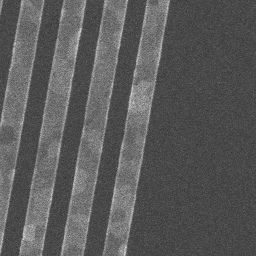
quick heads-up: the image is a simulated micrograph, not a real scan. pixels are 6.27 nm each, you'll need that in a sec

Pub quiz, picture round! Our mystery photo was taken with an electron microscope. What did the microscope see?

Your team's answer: parallel lines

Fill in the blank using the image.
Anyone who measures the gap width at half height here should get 122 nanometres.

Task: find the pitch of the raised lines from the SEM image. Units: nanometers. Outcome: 258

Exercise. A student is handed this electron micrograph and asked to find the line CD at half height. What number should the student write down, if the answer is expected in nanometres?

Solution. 137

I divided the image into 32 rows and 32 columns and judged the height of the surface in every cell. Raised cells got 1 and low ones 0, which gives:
00011000111001110011100000000000
00111000110001110011100000000000
00111000110001100011100000000000
00111001110001100011100000000000
00111001110011100011000000000000
00111001110011100111000000000000
00110001110011100111000000000000
00110001100011100111000000000000
01110001100011000111000000000000
01110011100111000111000000000000
01110011100111000110000000000000
01110011100111001110000000000000
01100011100111001110000000000000
11100011000111001110000000000000
11100111000110001110000000000000
11100111000110001100000000000000
11100111001110001100000000000000
11000111001110011100000000000000
11000111001110011100000000000000
11000110001110011100000000000000
11001110001100011100000000000000
11001110001100011000000000000000
11001110011100111000000000000000
10001110011100111000000000000000
10001100011100111000000000000000
10001100011000111000000000000000
10011100011000111000000000000000
10011100111000110000000000000000
10011100111001110000000000000000
00011100111001110000000000000000
00011000111001110000000000000000
00011000110001110000000000000000